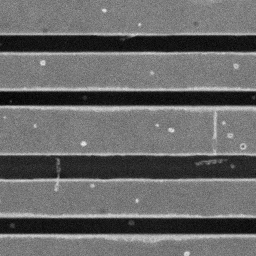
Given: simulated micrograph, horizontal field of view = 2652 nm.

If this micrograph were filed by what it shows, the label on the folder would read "lines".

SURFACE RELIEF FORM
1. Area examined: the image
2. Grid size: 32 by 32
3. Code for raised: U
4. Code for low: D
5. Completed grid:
UUUUUUUUUUUUUUUUUUUUUUUUUUUUUUUU
UUUUUUUUUUUUUUUUUUUUUUUUUUUUUUUU
UUUUUUUUUUUUUUUUUUUUUUUUUUUUUUUU
UUUUUUUUUUUUUUUUUUUUUUUUUUUUUUUU
DDDDDDDDDDDDDDDDUDDDDDDDDDDDDDDD
DDDDDDDDDDDDDDDDDDDDDDDDDDDDDDDD
DDDDDDDDDDDDDDDDDDDDDDDDDDDDDDDD
UUUUUUUUUUUUUUUUUUUUUUUUUUUUUUUU
UUUUUUUUUUUUUUUUUUUUUUUUUUUUUUUU
UUUUUUUUUUUUUUUUUUUUUUUUUUUUUUUU
UUUUUUUUUUUUUUUUUUUUUUUUUUUUUUUU
DDDDDDDDDDDDDDDDDDDDDDDDDDDDDDDD
DDDDDDDDDDDDDDDDDDDDDDDDDDDDDDDD
UUUUUUUUUUUUUUUUUUUUUUUUUUUUUUUU
UUUUUUUUUUUUUUUUUUUUUUUUUUUUUUUU
UUUUUUUUUUUUUUUUUUUUUUUUUUUUUUUU
UUUUUUUUUUUUUUUUUUUUUUUUUUUUUUUU
UUUUUUUUUUUUUUUUUUUUUUUUUUUUUUUU
UUUUUUUUUUUUUUUUUUUUUUUUUUUUUUUU
DDDDDDDDDDDDDDDDDDDDDDDDDDDDDDDD
DDDDDDDDDDDDDDDDDDDDDDDDDDDDDDDD
DDDDDDDDDDDDDDDDDDDDDDDDDDDDDDDD
UUUUUUUUUUUUUUUUUUUUUUUUUUUUUUUU
UUUUUUUUUUUUUUUUUUUUUUUUUUUUUUUU
UUUUUUUUUUUUUUUUUUUUUUUUUUUUUUUU
UUUUUUUUUUUUUUUUUUUUUUUUUUUUUUUU
UUUUUUUUUUUUUUUUUUUUUUUUUUUUUUUU
DDDDDDDDDDDDDDDDDDDDDDDDDDDDDDDD
DDDDDDDDDDDDDDDDDDDDDDDDDDDDDDDD
UUUUUUUUUUUUUUUUUUUUUUUUUUUUUUUU
UUUUUUUUUUUUUUUUUUUUUUUUUUUUUUUU
UUUUUUUUUUUUUUUUUUUUUUUUUUUUUUUU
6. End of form